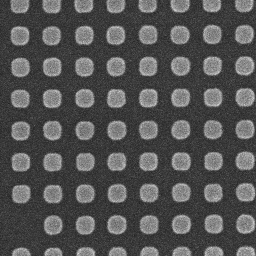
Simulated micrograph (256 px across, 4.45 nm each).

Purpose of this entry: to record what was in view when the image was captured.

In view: a regular array of raised bodies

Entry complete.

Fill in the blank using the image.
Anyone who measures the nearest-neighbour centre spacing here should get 140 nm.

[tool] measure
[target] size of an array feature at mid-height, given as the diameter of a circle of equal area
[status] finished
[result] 82.3 nanometers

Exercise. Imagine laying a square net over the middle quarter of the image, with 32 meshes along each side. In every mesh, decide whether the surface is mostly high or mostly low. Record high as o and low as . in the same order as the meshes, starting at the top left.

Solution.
...oooo....oooo....oooo....oooo.
...oooo....oooo....oooo....oooo.
....ooo.....oo......oo......ooo.
................................
................................
................................
....................oo......ooo.
...oooo....oooo....oooo....oooo.
...oooo....oooo....oooo....oooo.
...oooo....oooo....oooo....oooo.
....ooo.....ooo.....ooo.........
................................
................................
................................
............ooo.....oo......oo..
...oooo....oooo....oooo....oooo.
...oooo....oooo....oooo....oooo.
...oooo....oooo....oooo....oooo.
....ooo.....ooo.....oo......oo..
................................
................................
................................
....oo......ooo.....ooo.....ooo.
...ooooo...oooo....oooo....oooo.
...ooooo...oooo....oooo....oooo.
...oooo....oooo....oooo....oooo.
....ooo.........................
................................
................................
................................
....ooo.....ooo.....ooo.....ooo.
...oooo....oooo....oooo....oooo.